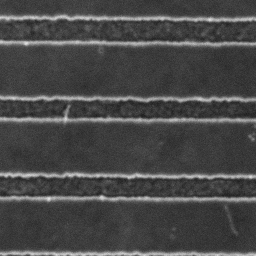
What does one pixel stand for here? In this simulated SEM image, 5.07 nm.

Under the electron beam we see lines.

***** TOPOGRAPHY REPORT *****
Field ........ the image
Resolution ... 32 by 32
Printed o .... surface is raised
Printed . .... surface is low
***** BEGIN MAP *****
oooooooooooooooooooooooooooooooo
oooooooooooooooooooooooooooooooo
.....................ooooooooooo
................................
................................
oooooooooooooooooooooooooooooooo
oooooooooooooooooooooooooooooooo
oooooooooooooooooooooooooooooooo
oooooooooooooooooooooooooooooooo
oooooooooooooooooooooooooooooooo
oooooooooooooooooooooooooooooooo
oooooooooooooooooooooooooooooooo
...oo.....oo.ooo.oooooooooooo.oo
................................
................................
oooooooooooooooooooooooooooooooo
oooooooooooooooooooooooooooooooo
oooooooooooooooooooooooooooooooo
oooooooooooooooooooooooooooooooo
oooooooooooooooooooooooooooooooo
oooooooooooooooooooooooooooooooo
oooooooooooooooooooooooooooooooo
................................
................................
................................
oooooooooooooooooooooooooooooooo
oooooooooooooooooooooooooooooooo
oooooooooooooooooooooooooooooooo
oooooooooooooooooooooooooooooooo
oooooooooooooooooooooooooooooooo
oooooooooooooooooooooooooooooooo
oooooooooooooooooooooooooooooooo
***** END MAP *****